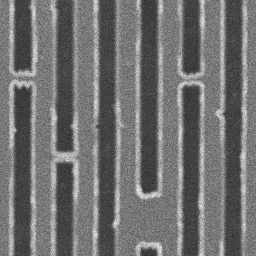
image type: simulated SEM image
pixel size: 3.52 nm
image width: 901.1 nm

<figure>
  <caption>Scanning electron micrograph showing parallel lines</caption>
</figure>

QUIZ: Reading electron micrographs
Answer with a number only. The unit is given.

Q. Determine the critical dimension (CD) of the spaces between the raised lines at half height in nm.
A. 59.8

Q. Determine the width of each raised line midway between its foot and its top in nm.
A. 90.1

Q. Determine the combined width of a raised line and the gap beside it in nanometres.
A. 148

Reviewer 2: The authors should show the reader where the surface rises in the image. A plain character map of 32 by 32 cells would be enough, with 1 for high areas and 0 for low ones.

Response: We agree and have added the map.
11001110011100011100111001110011
11001110011100011100111001110011
11001110011100011100111001110011
11001110011100011100111001110011
11001110011100011100111001110011
11001110011100011100111001110011
11001110011100011000111001110011
11001110011100011000111001110011
11001110011100011000111001110011
11111110011100011000111111110011
11111110011100111000111111110011
11001110011100111000111001110011
11001110011100111000111001110011
11001110011100111000111001110011
11001110011100111000111001110011
11001110011100111000111001110011
11001110011100111000111001110011
11001110011100111000111001110011
11001110011100111000111001110011
11001111111100111000111001110011
11001110011100111000111001110011
11001110011100111100111001110011
11001110011100111100111001110011
11001110011100111100111001110011
11001110011100111111111001110011
11001110011100111111111001110011
11001110011100111111111001110011
11001110011100111111111001110011
11001110011100111111111001110011
11001110011100111111111001110011
11001110011100111111111001110011
11001110011100111100111001110011